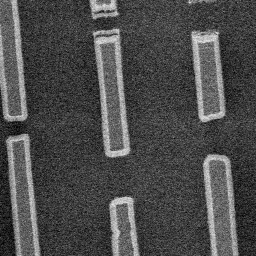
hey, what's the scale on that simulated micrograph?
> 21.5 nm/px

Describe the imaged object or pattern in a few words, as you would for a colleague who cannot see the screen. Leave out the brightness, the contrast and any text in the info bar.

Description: one or a few lines or trenches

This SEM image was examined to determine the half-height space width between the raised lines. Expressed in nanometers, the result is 1670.